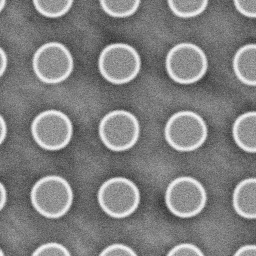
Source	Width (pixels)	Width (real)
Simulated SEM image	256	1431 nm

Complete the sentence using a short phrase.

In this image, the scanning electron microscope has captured an array of small figures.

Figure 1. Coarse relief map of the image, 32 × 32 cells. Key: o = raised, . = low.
....ooooo....oooo....ooooo...ooo
.....ooo......ooo.....ooo.....oo
................................
................................
................................
......o.........................
.....ooo.....oooo....oooo.....oo
o...ooooo....oooo....ooooo...ooo
o...ooooo....oooo....ooooo...ooo
.....ooo.....oooo....oooo.....oo
...............................o
................................
................................
................................
.....ooo.....oooo.....ooo.....oo
o...ooooo....oooo....oooo....ooo
o...ooooo....oooo....ooooo...ooo
.....oooo....oooo....oooo....ooo
......o.......oo......oo......oo
................................
................................
................................
.....ooo......oo......oo.......o
....ooooo....oooo....oooo.....oo
o...ooooo...ooooo....ooooo...ooo
....ooooo....oooo....oooo....ooo
.....ooo.....ooo......ooo.....oo
................................
................................
................................
................................
....oooo.....oooo....oooo.....oo